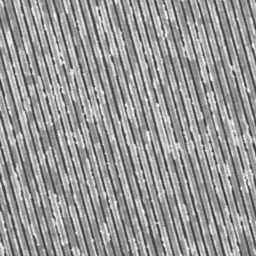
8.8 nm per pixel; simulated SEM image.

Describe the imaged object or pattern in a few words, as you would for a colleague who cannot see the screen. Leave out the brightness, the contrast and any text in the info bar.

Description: parallel lines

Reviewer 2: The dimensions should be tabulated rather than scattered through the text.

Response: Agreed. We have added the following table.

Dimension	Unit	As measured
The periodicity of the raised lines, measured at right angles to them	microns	0.0716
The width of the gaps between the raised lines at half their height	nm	25.4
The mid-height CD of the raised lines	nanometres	42.5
